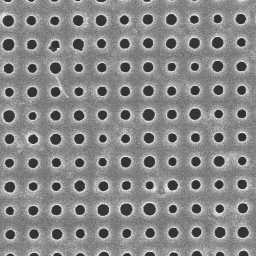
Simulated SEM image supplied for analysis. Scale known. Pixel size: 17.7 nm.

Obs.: a regular array of holes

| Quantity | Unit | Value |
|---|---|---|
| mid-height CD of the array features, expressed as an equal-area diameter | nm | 175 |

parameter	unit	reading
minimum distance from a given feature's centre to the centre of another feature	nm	409